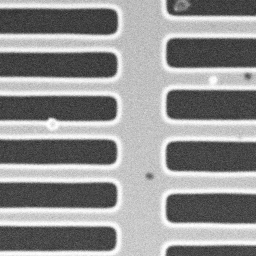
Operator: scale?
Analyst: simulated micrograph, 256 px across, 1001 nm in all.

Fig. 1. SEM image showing groups of lines, slits or small figures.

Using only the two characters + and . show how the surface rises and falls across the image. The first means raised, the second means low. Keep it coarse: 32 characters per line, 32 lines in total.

+++++++++++++++++++++...........
...............++++++...........
...............+++++++++++++++++
...............+++++++++++++++++
+++++++++++..+++++++++++++++++++
+++++++++++++++++++++...........
..............+++++++...........
...............++++++...........
...............++++++...........
..............++++++++++++++++++
++++++++++++++++++++++++++++++++
+++++++++++++++++++++...........
...............++++++...........
...............++++++...........
...............++++++...........
++++++++++++++++++++++++++++++++
++++++++++++++++++++++++++++++++
..............++++++++......++++
...............++++++...........
...............++++++...........
..............+++++++...........
+++++++++++++++++++++...........
++++++++++++++++++++++++++++++++
...............+++++++++++++++++
...............++++++...........
...............++++++...........
+++++++++++++++++++++...........
+++++++++++++++++++++...........
..............++++++++++++++++++
...............+++++++++++++++++
...............+++++++..........
..............+++++++...........